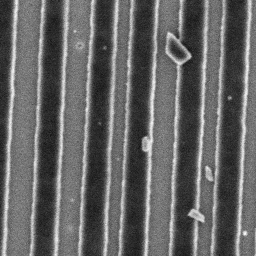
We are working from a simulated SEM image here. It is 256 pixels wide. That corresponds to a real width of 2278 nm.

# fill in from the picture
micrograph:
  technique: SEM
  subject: lines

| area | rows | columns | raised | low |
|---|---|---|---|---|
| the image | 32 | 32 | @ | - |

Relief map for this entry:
@@---@@@---@@@@-@@@@---@@@--@@@-
@@---@@@---@@@@-@@@@--@@@@--@@@-
@@---@@@---@@@@-@@@@--@@@@--@@@-
@@---@@@---@@@--@@@@--@@@@--@@@-
@@---@@@---@@@--@@@@-@@@@@--@@@-
@@---@@@---@@@--@@@--@@@@@--@@@-
@@---@@@---@@@--@@@--@@@@@--@@@-
@@---@@@---@@@--@@@---@@@@--@@@-
@@---@@@---@@@--@@@---@@@@-@@@@-
@@---@@@---@@@--@@@---@@@@-@@@@-
@@---@@@---@@@--@@@---@@@@-@@@@-
@@---@@@---@@@--@@@---@@@--@@@@-
@@---@@@---@@@--@@@---@@@--@@@@-
@----@@@---@@@--@@@---@@@--@@@@-
@----@@@---@@@--@@@---@@@--@@@@-
@----@@@---@@@--@@@---@@@--@@@@-
@---@@@@---@@@--@@@---@@@--@@@@-
@---@@@@---@@@--@@@---@@@--@@@--
@---@@@@---@@@--@@@---@@@--@@@--
@---@@@@--@@@@--@@@---@@@--@@@--
@---@@@@--@@@@-@@@@---@@@--@@@--
@---@@@@--@@@@-@@@@---@@@--@@@--
@---@@@---@@@@-@@@@---@@@--@@@--
@---@@@---@@@@-@@@@---@@@--@@@--
@---@@@---@@@@-@@@@---@@@--@@@--
@---@@@---@@@--@@@@--@@@@--@@@--
@---@@@---@@@--@@@@--@@@@--@@@--
@---@@@---@@@--@@@---@@@@--@@@--
@---@@@---@@@--@@@---@@@@--@@@--
@---@@@---@@@--@@@---@@@@--@@@--
@---@@@---@@@--@@@---@@@--@@@@--
@---@@@---@@@--@@@---@@@--@@@@--